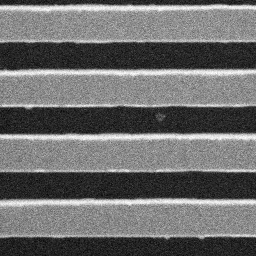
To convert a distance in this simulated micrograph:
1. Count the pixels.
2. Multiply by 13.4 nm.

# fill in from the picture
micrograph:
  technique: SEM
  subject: lines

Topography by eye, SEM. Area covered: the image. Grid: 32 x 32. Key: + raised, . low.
................................
++++++++++++++++++++++++++++++++
++++++++++++++++++++++++++++++++
++++++++++++++++++++++++++++++++
++++++++++++++++++++++++++++++++
................................
................................
................................
................................
++++++++++++++++++++++++++++++++
++++++++++++++++++++++++++++++++
++++++++++++++++++++++++++++++++
++++++++++++++++++++++++++++++++
................................
................................
................................
................................
++++++++++++++++++++++++++++++++
++++++++++++++++++++++++++++++++
++++++++++++++++++++++++++++++++
++++++++++++++++++++++++++++++++
................................
................................
................................
................................
++++++++++++++++++++++++++++++++
++++++++++++++++++++++++++++++++
++++++++++++++++++++++++++++++++
++++++++++++++++++++++++++++++++
+++++++++++++++++++++++++++.++++
................................
................................